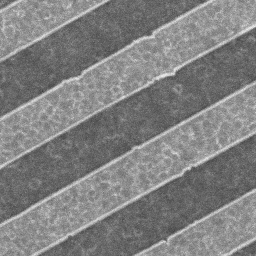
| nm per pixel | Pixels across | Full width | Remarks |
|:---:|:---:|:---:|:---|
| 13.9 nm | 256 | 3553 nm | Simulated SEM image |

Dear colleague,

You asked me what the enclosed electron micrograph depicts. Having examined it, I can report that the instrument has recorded one or a few lines or trenches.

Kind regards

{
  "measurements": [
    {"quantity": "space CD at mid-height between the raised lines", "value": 718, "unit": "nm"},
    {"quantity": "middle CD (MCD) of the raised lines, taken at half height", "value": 0.577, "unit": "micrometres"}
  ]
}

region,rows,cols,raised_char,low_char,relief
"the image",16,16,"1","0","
1111110000001111
1111000000011111
1100000001111100
1000000111110000
0000011111100000
0001111110000001
0011111000000011
1111100000001111
1110000000111111
1100000011111100
0000001111110000
0000011111000000
0001111100000001
0111110000000111
1111100000011111
1110000000111110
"